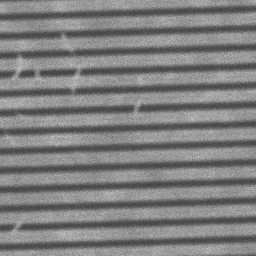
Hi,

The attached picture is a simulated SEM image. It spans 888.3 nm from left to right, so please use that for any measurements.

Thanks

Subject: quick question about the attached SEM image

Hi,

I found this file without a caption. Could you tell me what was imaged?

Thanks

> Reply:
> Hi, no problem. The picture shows parallel lines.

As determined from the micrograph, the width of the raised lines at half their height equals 44.6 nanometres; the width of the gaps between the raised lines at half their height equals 22.5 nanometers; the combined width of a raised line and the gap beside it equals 66.4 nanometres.